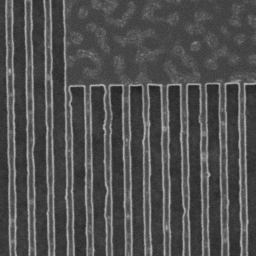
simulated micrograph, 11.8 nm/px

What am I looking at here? parallel lines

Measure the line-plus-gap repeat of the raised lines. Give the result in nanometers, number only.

228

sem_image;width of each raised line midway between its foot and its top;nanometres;78.5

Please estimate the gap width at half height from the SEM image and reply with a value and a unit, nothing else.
149 nm